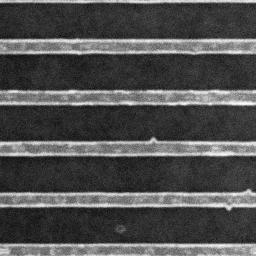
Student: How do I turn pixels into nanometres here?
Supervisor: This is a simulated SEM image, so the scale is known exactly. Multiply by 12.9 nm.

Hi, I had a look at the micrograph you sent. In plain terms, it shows parallel lines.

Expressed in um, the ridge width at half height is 0.163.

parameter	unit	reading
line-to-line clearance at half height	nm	502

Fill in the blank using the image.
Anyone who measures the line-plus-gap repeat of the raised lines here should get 658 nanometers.